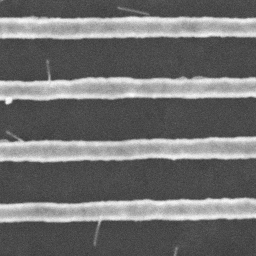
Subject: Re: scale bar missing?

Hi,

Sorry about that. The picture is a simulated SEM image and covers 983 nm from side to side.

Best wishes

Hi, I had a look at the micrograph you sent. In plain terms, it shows lines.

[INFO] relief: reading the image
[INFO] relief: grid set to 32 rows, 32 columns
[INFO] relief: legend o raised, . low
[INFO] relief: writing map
................................
................................
oooooooooooooooooooooooooooooooo
oooooooooooooooooooooooooooooooo
oooooooooooooooooooooooooo.ooooo
................................
................................
................................
................................
................................
oooooooooooooooooooooooooooooooo
oooooooooooooooooooooooooooooooo
oo..............................
................................
................................
................................
................................
................oooooooooooooooo
oooooooooooooooooooooooooooooooo
oooooooooooooooooooooooooooooooo
................................
................................
................................
................................
................................
oooooooooooooooooooooooooooooooo
oooooooooooooooooooooooooooooooo
ooooooooooooo...................
................................
................................
................................
................................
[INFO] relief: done